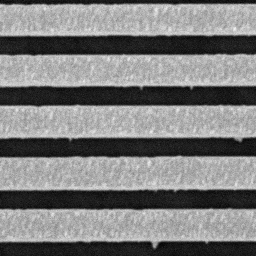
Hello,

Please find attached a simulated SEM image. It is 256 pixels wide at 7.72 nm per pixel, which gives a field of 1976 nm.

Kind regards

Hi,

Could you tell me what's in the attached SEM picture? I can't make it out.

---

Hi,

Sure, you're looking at lines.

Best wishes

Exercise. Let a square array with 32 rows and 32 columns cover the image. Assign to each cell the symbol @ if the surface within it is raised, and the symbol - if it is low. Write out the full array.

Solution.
--------------------------------
@@@@@@@@@@@@@@@@@@@@@@@@@@@@@@@@
@@@@@@@@@@@@@@@@@@@@@@@@@@@@@@@@
@@@@@@@@@@@@@@@@@@@@@@@@@@@@@@@@
--------------------------------
--------------------------------
--------------------------------
@@@@@@@@@@@@@@@@@@@@@@@@@@@@@@@@
@@@@@@@@@@@@@@@@@@@@@@@@@@@@@@@@
@@@@@@@@@@@@@@@@@@@@@@@@@@@@@@@@
@@@@@@@@@@@@@@@@@@@@@@@@@@@@@@@@
--------------------------------
--------------------------------
@@@@@@@@@@@@@@@@@@@@@@@@@@@@@@@@
@@@@@@@@@@@@@@@@@@@@@@@@@@@@@@@@
@@@@@@@@@@@@@@@@@@@@@@@@@@@@@@@@
@@@@@@@@@@@@@@@@@@@@@@@@@@@@@@@@
--------------------------------
--------------------------------
--------------------------------
@@@@@@@@@@@@@@@@@@@@@@@@@@@@@@@@
@@@@@@@@@@@@@@@@@@@@@@@@@@@@@@@@
@@@@@@@@@@@@@@@@@@@@@@@@@@@@@@@@
@@@@@@@@@@@@@@@@@@@@@@@@@@@@@@@@
--------------------------------
--------------------------------
@@@@@@@@@@@@@@@@@@@@@@@@@@@@@@@@
@@@@@@@@@@@@@@@@@@@@@@@@@@@@@@@@
@@@@@@@@@@@@@@@@@@@@@@@@@@@@@@@@
@@@@@@@@@@@@@@@@@@@@@@@@@@@@@@@@
--------------------------------
--------------------------------